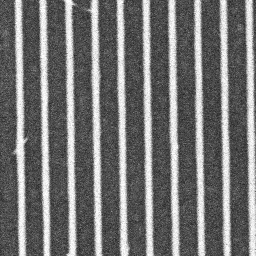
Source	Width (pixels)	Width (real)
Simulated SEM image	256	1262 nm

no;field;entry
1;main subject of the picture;parallel lines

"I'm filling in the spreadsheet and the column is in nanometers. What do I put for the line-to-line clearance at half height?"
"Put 98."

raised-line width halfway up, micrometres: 0.0259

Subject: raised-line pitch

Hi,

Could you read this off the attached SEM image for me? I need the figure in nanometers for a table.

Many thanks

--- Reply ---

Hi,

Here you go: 126